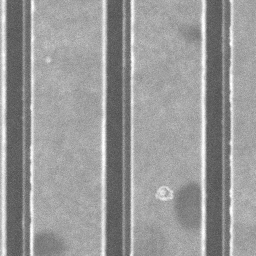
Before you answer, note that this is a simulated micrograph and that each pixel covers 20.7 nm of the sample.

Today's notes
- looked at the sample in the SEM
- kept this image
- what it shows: lines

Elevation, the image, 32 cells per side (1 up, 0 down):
00001111111110001111111110000111
10001111111110001111111110000111
10001111111110001111111110000111
00001111111110001111111110000111
00001111111110001111111110000111
00001111111110001111111110000111
10001111111110001111111110000111
10001111111110001111111110000111
10001111111110001111111110000111
10001111111110001111111110000111
10001111111110001111111110000111
10001111111110001111111110000111
10001111111110001111111110000111
10001111111110001111111110000111
00001111111110001111111110000111
10001111111110001111111110000111
10001111111110001111111110000111
10001111111110001111111110000111
00001111111110001111111110000111
10001111111110001111111110000111
00001111111110001111111110000111
00001111111110001111111110000111
00001111111110001111111110000111
00001111111110001111111110000111
00001111111110001111111110000111
00001111111110001111111110000111
00001111111110001111111110000111
00001111111110001111111110000111
00001111111110001111111110000111
00001111111110001111111110000111
00001111111110001111111110000111
10001111111110001111111110000111